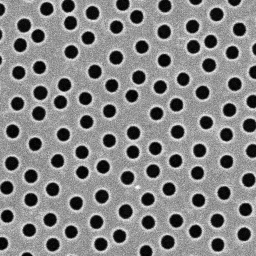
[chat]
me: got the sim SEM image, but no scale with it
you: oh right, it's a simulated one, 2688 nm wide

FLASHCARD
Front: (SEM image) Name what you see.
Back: a regular array of holes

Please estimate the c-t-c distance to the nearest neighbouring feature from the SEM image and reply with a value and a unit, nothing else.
243 nanometres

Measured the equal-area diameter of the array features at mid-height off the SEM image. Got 146 nanometers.